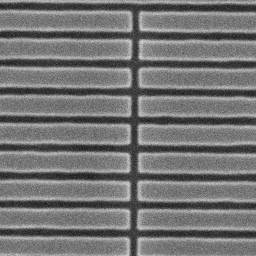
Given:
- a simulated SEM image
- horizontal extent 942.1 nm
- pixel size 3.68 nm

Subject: groups of lines, slits or small figures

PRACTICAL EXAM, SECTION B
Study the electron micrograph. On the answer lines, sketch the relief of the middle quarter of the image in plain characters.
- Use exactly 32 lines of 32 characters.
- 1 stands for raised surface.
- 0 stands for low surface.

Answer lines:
00000000000000000000000000000000
11111111111111110001111111111111
11111111111111110001111111111111
11111111111111110001111111111111
11111111111111110001111111111111
11111111111111110001111111111111
00000000000000000000000000000000
00000000000000000000000000000000
11111111111111110001111111111111
11111111111111110001111111111111
11111111111111110001111111111111
11111111111111110001111111111111
11111111111111110001111111111111
00000000000000000000000000000000
00000000000000000000000000000000
11111111111111110001111100000000
11111111111111110001111111111111
11111111111111110001111111111111
11111111111111110001111111111111
11111111111111110001111111111111
00000000000000000000000000000000
00000000000000000000000000000000
11111111111110000000000000110000
11111111111111110001111111111111
11111111111111110001111111111111
11111111111111110001111111111111
11111111111111110001111111111111
00000000000000000000000000000000
00000000000000000000000000000000
11111111111111010001111111110000
11111111111111110001111111111111
11111111111111110001111111111111